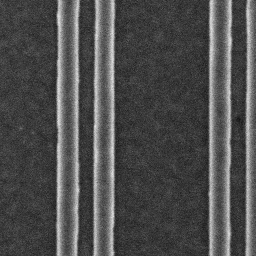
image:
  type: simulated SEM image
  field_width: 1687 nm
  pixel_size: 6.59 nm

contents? lines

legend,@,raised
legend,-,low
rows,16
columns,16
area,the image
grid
----@@@------@@@
----@@@------@@@
----@@@------@@@
----@@@------@@@
----@@@------@@@
----@@@------@@@
----@@@------@@@
----@@@------@@@
----@@@------@@@
----@@@------@@@
----@@@------@@@
----@@@------@@@
----@@@------@@@
----@@@------@@@
----@@@------@@@
----@@@------@@@